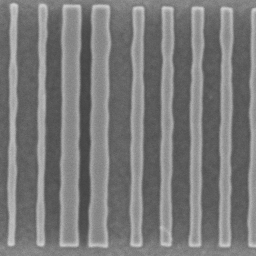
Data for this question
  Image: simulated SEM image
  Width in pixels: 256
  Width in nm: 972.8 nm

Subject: groups of lines, slits or small figures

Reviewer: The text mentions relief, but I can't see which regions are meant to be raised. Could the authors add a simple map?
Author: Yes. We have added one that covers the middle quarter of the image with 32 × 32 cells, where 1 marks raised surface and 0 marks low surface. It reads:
11110001111000000111000001100000
11110001111000000111000001100000
11110001111000000111000001100000
11110001111000000111000001100000
11110001111000000111000001100000
11110001111000000111000011100000
11110001111000000111000011100000
11110001111000000111000011100000
11110001111000000111000011100000
11110001111000000111000001100000
11110001111000000111000001100000
11110001111000000111000001100000
11110001111000000111000001100000
11110001111000000111000001100000
11110001111000000111000011100000
11110001111000000111000011100000
11110001111000000111000001100000
11110001111000000111000001100000
11110001111000000111000001100000
11110001111000000111000011100000
11110001111000000110000011100000
11110001111000000111000011100000
11110001111000000111000011100000
11110001111000000111000011100000
11110001111000000111000011100000
11110001111000000111000011100000
11110001111000000110000011100000
11110001111000000110000011100000
11110001111000000110000011100000
11110001111000000110000011100000
11110001111000000110000011100000
11110001111000000110000011100000